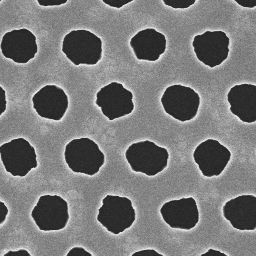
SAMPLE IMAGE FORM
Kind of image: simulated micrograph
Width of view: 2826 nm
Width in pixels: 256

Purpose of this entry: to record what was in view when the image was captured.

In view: a regular array of holes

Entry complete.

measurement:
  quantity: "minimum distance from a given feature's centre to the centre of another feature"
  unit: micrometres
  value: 0.697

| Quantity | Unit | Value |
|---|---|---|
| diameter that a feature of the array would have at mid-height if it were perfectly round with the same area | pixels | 36.1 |